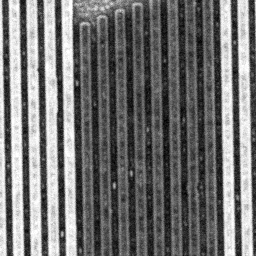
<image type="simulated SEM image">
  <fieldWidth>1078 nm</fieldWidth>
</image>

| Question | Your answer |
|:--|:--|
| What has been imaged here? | parallel lines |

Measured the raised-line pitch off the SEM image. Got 74.1 nanometers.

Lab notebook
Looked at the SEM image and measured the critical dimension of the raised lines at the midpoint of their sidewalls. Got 36.3 nanometers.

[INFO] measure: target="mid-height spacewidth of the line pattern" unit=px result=9.5